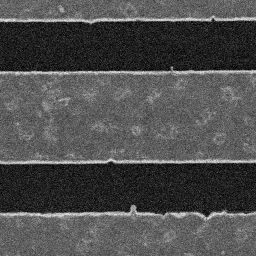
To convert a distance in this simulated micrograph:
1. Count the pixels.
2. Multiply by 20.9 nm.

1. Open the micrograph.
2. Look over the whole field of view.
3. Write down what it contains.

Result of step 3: one or a few lines or trenches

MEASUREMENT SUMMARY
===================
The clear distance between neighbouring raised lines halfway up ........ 1.1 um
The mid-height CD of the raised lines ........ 1860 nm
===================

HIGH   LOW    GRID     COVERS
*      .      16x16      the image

****************
................
................
................
.............***
****************
****************
****************
****************
****************
................
................
................
****************
****************
****************